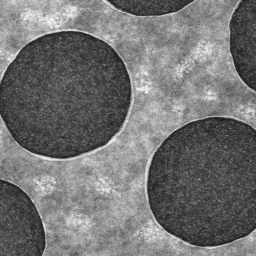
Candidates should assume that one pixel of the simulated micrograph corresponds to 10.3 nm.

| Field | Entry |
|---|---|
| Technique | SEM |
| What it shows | holes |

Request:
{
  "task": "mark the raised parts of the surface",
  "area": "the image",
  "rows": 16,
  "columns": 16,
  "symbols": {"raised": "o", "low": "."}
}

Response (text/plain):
ooooooo....oooo.
oooooooooooooo..
oo....oooooooo..
o......ooooooo..
........ooooooo.
........oooooooo
........oooooooo
........oooo...o
o......oooo.....
oo....oooo......
ooooooooo.......
.oooooooo.......
..ooooooo.......
..oooooooo......
...ooooooo......
...ooooooooooooo